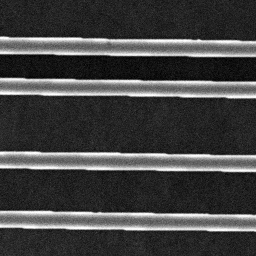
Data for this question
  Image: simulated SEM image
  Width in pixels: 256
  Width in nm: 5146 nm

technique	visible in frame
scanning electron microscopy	lines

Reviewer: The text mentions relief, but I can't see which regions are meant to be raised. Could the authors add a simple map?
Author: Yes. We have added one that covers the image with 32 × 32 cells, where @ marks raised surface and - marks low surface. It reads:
--------------------------------
--------------------------------
--------------------------------
--------------------------------
--------------------------------
@@@@@@@@@@@@@@@@@@@@@@@@@@@@@@@@
@@@@@@@@@@@@@@@@@@@@@@@@@@@@@@@@
--------------------------------
--------------------------------
--------------------------------
@@@@@@@@@@@@@@@@@@@@@@@@@@@@@@@@
@@@@@@@@@@@@@@@@@@@@@@@@@@@@@@@@
--------------------------------
--------------------------------
--------------------------------
--------------------------------
--------------------------------
--------------------------------
--------------------------------
@@@@@@@@@@@@@@@@@@@@@@@@@@@-----
@@@@@@@@@@@@@@@@@@@@@@@@@@@@@@@@
--------------------------------
--------------------------------
--------------------------------
--------------------------------
--------------------------------
@@@@@@@-------------------------
@@@@@@@@@@@@@@@@@@@@@@@@@@@@@@@@
--------@@@@@@@@@@@@@@@@@@@@@@@@
--------------------------------
--------------------------------
--------------------------------